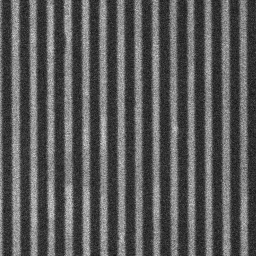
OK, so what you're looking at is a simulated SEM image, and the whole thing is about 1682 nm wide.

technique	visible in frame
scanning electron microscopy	parallel lines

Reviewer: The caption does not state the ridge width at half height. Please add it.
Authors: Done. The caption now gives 0.032 micrometres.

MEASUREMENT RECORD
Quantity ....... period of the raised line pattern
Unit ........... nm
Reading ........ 115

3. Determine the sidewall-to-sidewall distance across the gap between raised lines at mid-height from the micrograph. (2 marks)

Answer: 81.4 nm